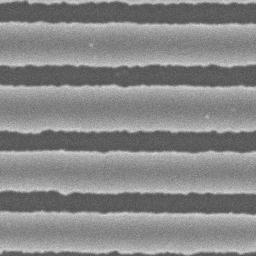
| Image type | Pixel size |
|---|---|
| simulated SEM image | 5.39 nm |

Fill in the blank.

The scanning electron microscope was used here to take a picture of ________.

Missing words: lines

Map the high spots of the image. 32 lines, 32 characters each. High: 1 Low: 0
00000000000000000000000000000000
00000000000000000000000000000000
00000000000000000000000000000000
11111111111111111111111111111111
11111111111111111111111111111111
11111111111111111111111111111111
11111111111111111111111111111111
11111111111111111111111111111111
00000000000000000000000000000000
00000000000000000000000000000000
00000000000000000000000000000000
11111111111111111111111111111111
11111111111111111111111111111111
11111111111111111111111111111111
11111111111111111111111111111111
11111111111111111111111111111111
00011000000000000000000000000000
00000000000000000000000000000000
00000000000000000000000000000000
11111111111111111111111111111111
11111111111111111111111111111111
11111111111111111111111111111111
11111111111111111111111111111111
11111111111111111111111111111111
00000000000000000000000000000000
00000000000000000000000000000000
00000000000000000000000000000000
11111111111111111111111111111111
11111111111111111111111111111111
11111111111111111111111111111111
11111111111111111111111111111111
00010000001111011111111110011110